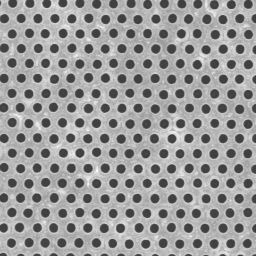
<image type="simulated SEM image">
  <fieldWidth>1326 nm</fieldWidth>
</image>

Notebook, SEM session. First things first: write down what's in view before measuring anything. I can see a regular array of holes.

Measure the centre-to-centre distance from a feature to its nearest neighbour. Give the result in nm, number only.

84.4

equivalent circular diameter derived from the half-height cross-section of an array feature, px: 9.36